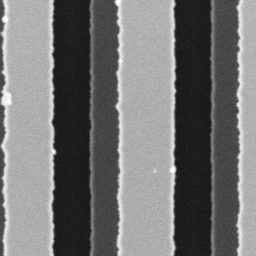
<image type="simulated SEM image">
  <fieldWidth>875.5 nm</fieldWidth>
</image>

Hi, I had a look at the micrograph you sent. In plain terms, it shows lines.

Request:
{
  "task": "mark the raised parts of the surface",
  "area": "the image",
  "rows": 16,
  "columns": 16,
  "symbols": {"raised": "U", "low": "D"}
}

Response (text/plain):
UUUDDDUUUUUDDUUU
UUUDDDUUUUUDDUUU
UUUDDDUUUUUDDUUU
UUUDDDUUUUUDDUUU
UUUDDDUUUUUDDUUU
UUUDDDUUUUUDDUUU
UUUDDDUUUUUDDUUU
UUUDDDUUUUUDDUUU
UUUDDDUUUUUDDUUU
UUUDDDUUUUUDDUUU
UUUDDDUUUUUDDUUU
UUUDDDUUUUUDDUUU
UUUDDDUUUUUDDUUU
UUUDDDUUUUUDDUUU
UUUDDDUUUUUDDUUU
UUUDDDUUUUUDDUUU